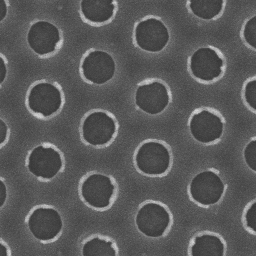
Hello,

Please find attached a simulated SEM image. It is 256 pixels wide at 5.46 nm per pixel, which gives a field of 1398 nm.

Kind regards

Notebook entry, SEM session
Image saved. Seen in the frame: a regular array of holes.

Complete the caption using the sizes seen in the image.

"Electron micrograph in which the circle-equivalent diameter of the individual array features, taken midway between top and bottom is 179 nm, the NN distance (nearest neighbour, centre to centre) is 334 nanometers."